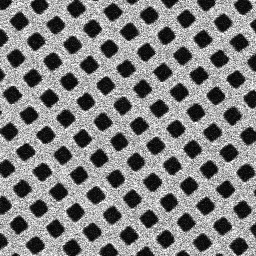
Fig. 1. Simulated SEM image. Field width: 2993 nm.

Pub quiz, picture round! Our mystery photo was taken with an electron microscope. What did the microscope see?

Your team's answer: a regular array of holes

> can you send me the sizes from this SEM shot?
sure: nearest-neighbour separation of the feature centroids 302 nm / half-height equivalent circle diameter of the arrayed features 16.9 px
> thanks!